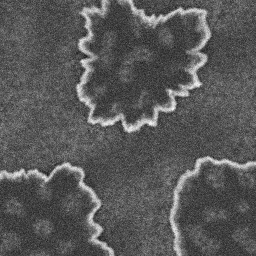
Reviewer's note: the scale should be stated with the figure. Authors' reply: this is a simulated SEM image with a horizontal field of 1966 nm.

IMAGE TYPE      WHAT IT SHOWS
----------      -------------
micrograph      raised bodies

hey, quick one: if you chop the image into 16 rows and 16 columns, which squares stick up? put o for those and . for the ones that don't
......oo........
.....oooooooo...
.....oooooooo...
.....oooooooo...
.....ooooooo....
.....ooooooo....
.....oooooo.....
......ooo.......
................
................
....o.......oooo
ooooo......ooooo
oooooo.....ooooo
oooooo.....ooooo
oooooo.....ooooo
ooooooo....ooooo